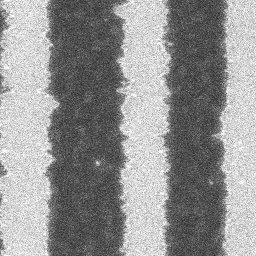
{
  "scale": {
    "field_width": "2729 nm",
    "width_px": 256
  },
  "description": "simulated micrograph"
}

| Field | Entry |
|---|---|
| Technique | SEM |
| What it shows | one or a few lines or trenches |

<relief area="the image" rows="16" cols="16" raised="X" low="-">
---XXXXX--XXXX--
X--XXXXX--XXXX--
---XXXXX--XXXX--
---XXXXX--XXXX--
---XXXXX--XXXX--
---XXXXX--XXXX--
---XXXXX--XXXX--
---XXXXX--XXXX--
---XXXXX--XXXX--
---XXXXX--XXXX--
---XXXXX--XXXX--
---XXXXX--XXXX--
---XXXXX--XXXX--
---XXXXX--XXXX--
---XXXXX--XXXX--
---XXXXX--XXXX--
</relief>